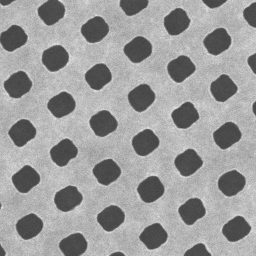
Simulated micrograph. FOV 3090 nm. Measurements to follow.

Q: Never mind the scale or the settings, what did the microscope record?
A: a regular array of holes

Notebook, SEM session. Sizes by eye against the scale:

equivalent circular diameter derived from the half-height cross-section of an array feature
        314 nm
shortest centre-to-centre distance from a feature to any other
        0.556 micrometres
